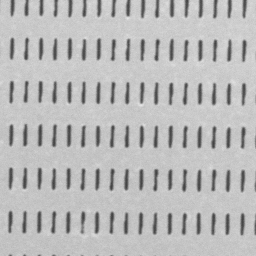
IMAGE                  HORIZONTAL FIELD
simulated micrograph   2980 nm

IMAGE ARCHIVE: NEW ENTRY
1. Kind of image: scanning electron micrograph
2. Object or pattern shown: a regular array of holes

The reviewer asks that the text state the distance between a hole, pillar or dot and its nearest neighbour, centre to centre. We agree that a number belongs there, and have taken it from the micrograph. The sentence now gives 168 nanometers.